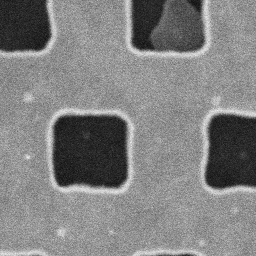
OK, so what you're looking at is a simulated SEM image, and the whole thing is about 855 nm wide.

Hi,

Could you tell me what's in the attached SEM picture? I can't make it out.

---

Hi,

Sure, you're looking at holes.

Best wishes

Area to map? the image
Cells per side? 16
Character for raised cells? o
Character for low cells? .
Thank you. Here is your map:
...ooooo.....ooo
...ooooo.....ooo
...ooooo.....ooo
oooooooooooooooo
oooooooooooooooo
oooooooooooooooo
oooooooooooooooo
oooo....ooooo...
ooo.....ooooo...
ooo.....ooooo...
ooo.....ooooo...
oooo....ooooo...
oooooooooooooooo
oooooooooooooooo
oooooooooooooooo
oooooooooooooooo